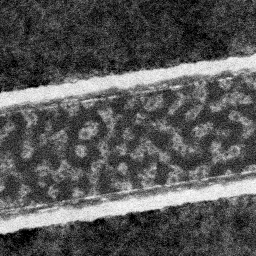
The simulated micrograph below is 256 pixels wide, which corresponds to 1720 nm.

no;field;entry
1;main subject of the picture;one or a few lines or trenches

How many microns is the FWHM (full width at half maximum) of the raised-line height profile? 0.86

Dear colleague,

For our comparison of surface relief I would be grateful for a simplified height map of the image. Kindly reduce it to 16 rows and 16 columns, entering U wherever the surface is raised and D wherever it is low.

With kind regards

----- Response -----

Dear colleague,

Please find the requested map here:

DDDDDDDDDDDDDDDD
DDDDDDDDDDDDDDDD
DDDDDDDDDDDDDDDD
DDDDDDDDDDDDDDDD
DDDDDDDDDDDUUUUU
DDDDDUUUUUUUUUUU
UUUUUUUUUUUUUUUU
UUUUUUUUUUUUUUUU
UUUUUUUUUUUUUUUU
UUUUUUUUUUUUUUUU
UUUUUUUUUUUUUUUU
UUUUUUUUUUUUUUUU
UUUUUUUUUUUDDDDD
UUUUUDDDDDDDDDDD
DDDDDDDDDDDDDDDD
DDDDDDDDDDDDDDDD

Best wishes